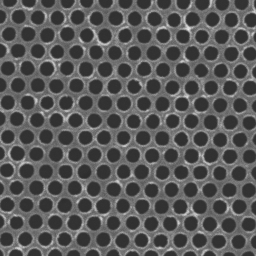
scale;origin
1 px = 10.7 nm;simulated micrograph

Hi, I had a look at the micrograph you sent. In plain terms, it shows a regular array of holes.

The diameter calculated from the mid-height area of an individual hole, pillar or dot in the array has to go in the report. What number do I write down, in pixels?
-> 14.5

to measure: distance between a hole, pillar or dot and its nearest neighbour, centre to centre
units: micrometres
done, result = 0.201